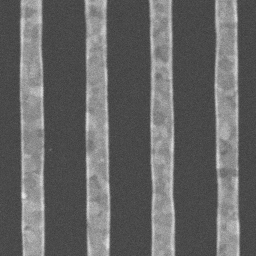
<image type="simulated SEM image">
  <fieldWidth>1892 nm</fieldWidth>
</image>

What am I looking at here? wiring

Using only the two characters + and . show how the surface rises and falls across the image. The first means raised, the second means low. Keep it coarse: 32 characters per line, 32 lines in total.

...++......++......++......++...
...++......++......++......++...
...++......++......++......+++..
...++......++......++......+++..
...++......++......++......++...
...++......++......++......++...
...++......++......++......++...
...++......++......++......+++..
...++......++......++......+++..
...++......++......++......++...
...++......++......++......+++..
...++......++......++......+++..
...++......++......++......+++..
...++......++......+++.....+++..
...++......++......+++.....+++..
...++......++......+++.....+++..
...++......++......+++.....+++..
...++......++......+++.....+++..
...++......++......+++.....+++..
...++......++......++......+++..
...++......++......++......+++..
...++......++......++......+++..
...++......++......++......+++..
...++......++......++.......++..
...++......+++.....++.......+...
...++......+++.....+++......+...
...++......+++.....+++.....+++..
...++......+++.....+++.....+++..
...++......+++.....+++.....+++..
...++......+++.....+++.....+++..
...++......++......+++.....+++..
...++......++......+++.....+++..